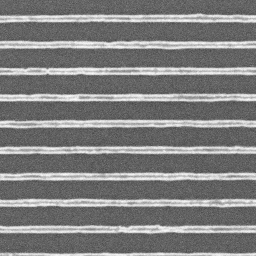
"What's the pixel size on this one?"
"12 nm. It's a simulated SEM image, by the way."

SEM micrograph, parallel lines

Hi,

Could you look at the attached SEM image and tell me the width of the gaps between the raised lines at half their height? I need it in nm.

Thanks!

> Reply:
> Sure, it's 256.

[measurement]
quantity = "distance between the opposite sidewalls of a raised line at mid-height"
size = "61.4 nm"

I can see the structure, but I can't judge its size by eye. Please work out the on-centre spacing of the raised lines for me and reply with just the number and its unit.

0.316 µm